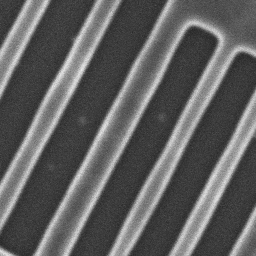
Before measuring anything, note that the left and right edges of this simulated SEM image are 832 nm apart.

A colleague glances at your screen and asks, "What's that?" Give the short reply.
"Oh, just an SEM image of groups of lines, slits or small figures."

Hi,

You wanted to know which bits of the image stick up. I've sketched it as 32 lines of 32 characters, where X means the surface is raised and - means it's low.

---XXX------XXX------XXXXXXXXXXX
---XX-------XX------XXXXXXXXXXXX
--XXX------XXX------XXXXXXXXXXXX
--XX-------XX------XXXX---XXXXXX
-XXX------XXX------XXXX----XXXXX
-XX------XXX------XXXX-----XXXXX
XXX------XXX------XXXX-----XXX-X
XX-------XX------XXXX------XX---
XX------XXX------XXXX-----XX----
X------XXX------XXXX-----XXX----
X------XX-------XXXX-----XX-----
------XXX------XXXX-----XXX-----
------XX-------XXX------XX------
-----XXX------XXXX-----XX------X
-----XX-------XXX------XX------X
----XXX------XXXX-----XX------XX
----XX-------XXX------XX------XX
---XXX------XXXX-----XX------XX-
---XX-------XXX------XX------XX-
--XXX------XXXX-----XX------XX--
--XX-------XXX------XX-----XX---
-XXX------XXXX-----XX------XX---
-XX------XXXX------XX-----XX----
XXX------XXXX-----XX------XX----
XX------XXXX-----XXX-----XX-----
XX------XXXX-----XX------XX-----
X------XXXX-----XXX-----XX------
X------XXXX-----XX------XX-----X
------XXXX-----XXX-----XX------X
------XXXX-----XX------XX-----XX
-----XXXX-----XXX-----XX------XX
X----XXXX-----XX------XX-----XXX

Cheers